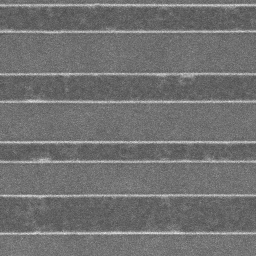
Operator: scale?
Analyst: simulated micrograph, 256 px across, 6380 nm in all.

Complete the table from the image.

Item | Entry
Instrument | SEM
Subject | one or a few lines or trenches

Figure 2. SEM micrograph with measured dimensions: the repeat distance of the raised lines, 1630 nanometers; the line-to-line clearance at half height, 969 nanometres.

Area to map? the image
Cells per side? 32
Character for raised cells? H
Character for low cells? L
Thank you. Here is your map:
LLLLLLLLLLLLLLLLLLLLLLLLLLLLLLLL
HHHHHHHHHHHHHHHHHHHHHHHHHHHHHHHH
HHHHHHHHHHHHHHHHHHHHHHHHHHHHHHHH
HHHHHHHHHHHHHHHHHHHHHHHHHHHHHHHH
LLLLLLLLLLLLLLLLLLLLLLLLLLLLLLLL
LLLLLLLLLLLLLLLLLLLLLLLLLLLLLLLL
LLLLLLLLLLLLLLLLLLLLLLLLLLLLLLLL
LLLLLLLLLLLLLLLLLLLLLLLLLLLLLLLL
LLLLLLLLLLLLLLLLLLLLLLLLLLLLLLLL
HHHHHHHHHHHHHHHHHHHHHHHHHHHHHHHH
HHHHHHHHHHHHHHHHHHHHHHHHHHHHHHHH
HHHHHHHHHHHHHHHHHHHHHHHHHHHHHHHH
HHHHHHHHHHHHHHHHHHHHHHHHHHHHHHHH
LLLLLLLLLLLLLLLLLLLLLLLLLLLLLLLL
LLLLLLLLLLLLLLLLLLLLLLLLLLLLLLLL
LLLLLLLLLLLLLLLLLLLLLLLLLLLLLLLL
LLLLLLLLLLLLLLLLLLLLLLLLLLLLLLLL
LLLLLLLLLLLLLLLLLLLLLLLLLLLLLLLL
HHHHHHHHHHHHHHHHHHHHHHHHHHHHHHHH
HHHHHHHHHHHHHHHHHHHHHHHHHHHHHHHH
LLLLLLLLLLLLLLLLLLLLLLLLLLLLLLLL
LLLLLLLLLLLLLLLLLLLLLLLLLLLLLLLL
LLLLLLLLLLLLLLLLLLLLLLLLLLLLLLLL
LLLLLLLLLLLLLLLLLLLLLLLLLLLLLLLL
HHHHHHHHHHHHHHHHHHHHHHHHHHHHHHHH
HHHHLHHHHHHHHHHHHHHHHHHHHHHHHHHH
HHHHHHHHHHHHHHHHHHHHHHHHHHHHHHHH
HHHHHHHHHHHHHHHHHHHHHHHHHHHHHHHH
HHHHHHHHHHHHHHHHHHHHHHHHHHHHHHHH
LLLLLLLLLLLLLLLLLLLLLLLLLLLLLLLL
LLLLLLLLLLLLLLLLLLLLLLLLLLLLLLLL
LLLLLLLLLLLLLLLLLLLLLLLLLLLLLLLL